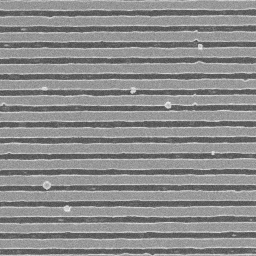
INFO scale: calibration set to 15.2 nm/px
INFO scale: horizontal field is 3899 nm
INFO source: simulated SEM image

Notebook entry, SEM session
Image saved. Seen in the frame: parallel lines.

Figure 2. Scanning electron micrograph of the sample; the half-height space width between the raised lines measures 93.3 nanometres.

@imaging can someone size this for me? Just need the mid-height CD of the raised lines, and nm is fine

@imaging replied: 148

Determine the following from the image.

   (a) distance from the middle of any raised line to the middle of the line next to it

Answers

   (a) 242 nm